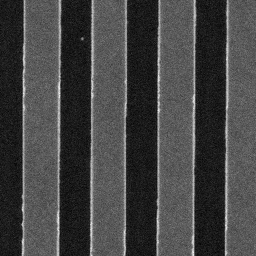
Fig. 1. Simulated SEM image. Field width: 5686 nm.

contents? lines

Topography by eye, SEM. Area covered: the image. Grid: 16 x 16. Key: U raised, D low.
DDUUDDUUDDUUDDUU
DDUUDDUUDDUUDDUU
DDUUDDUUDDUUDDUU
DUUUDDUUDDUUDDUU
DUUUDDUUDDUUDDUU
DUUUDDUUDDUUDDUU
DUUUDDUUDDUUDDUU
DUUUDDUUDDUUDDUU
DUUUDDUUDDUUDDUU
DUUUDDUUDDUUDDUU
DUUUDDUUDDUUDDUU
DUUUDDUUDDUUDDUU
DUUUDDUUDDUUDDUU
DUUUDDUUDDUUDDUU
DUUUDDUUDDUUDDUU
DUUUDDUUDDUUDDUU